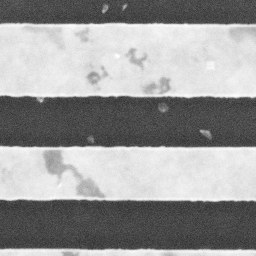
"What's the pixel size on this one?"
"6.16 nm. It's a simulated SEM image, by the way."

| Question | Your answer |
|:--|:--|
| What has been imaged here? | lines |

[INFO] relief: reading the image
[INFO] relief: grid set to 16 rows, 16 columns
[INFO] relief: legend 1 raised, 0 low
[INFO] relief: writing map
0000000000000000
0000001100000000
1111111111111111
1111111111111111
1111111111111111
1111111111111111
0000000000000000
0000000000000000
0000000000000000
1111111111111111
1111111111111111
1111111111111111
0000000000001111
0000000000000000
0000000000000000
0000000000000000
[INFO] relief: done